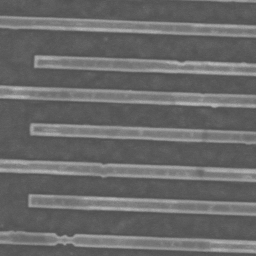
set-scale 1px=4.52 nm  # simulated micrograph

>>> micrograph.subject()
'parallel lines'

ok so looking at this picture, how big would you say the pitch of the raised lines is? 36 pixels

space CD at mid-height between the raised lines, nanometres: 114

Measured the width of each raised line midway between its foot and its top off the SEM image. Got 48 nanometers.